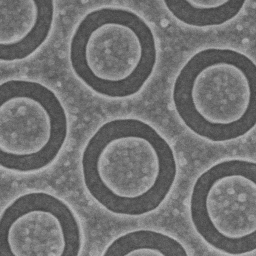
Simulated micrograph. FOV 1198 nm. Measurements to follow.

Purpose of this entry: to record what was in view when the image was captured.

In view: ring-shaped grooves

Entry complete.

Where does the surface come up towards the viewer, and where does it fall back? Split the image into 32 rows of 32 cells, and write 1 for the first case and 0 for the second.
11110001111111111111100011110011
11110001111000001111100000000011
11110001110000000011110000000111
11110011110011110001111111111111
11100011100111111001111111111111
00000111100111111001111111111111
00001111100111111101111110000011
00111111100111111001111100000001
11111111100111111001111000111000
11111111110011110001110001111110
00000111111000000011110011111110
00000011111100000111110011111110
01110001111111111111110011111110
11111000111111111111110011111110
11111100111111111111111001111100
11111100111110000011111000000000
11111100111100000000111100000001
11111100111000011100111111001111
11111000111001111110011111111111
00000001110001111111001111111111
00000011110011111111001111100000
11111111110011111111001111000000
11111111111001111110001110011110
11111111111000111110011100111111
11100001111100011000011100111111
10000000111110000000111100111111
00001000011111000011111100111111
00111110001111111111111100111111
01111111001111111111111100011111
01111111001111100000011110001100
01111111001111000000001111000000
00111111001110001111000111110001